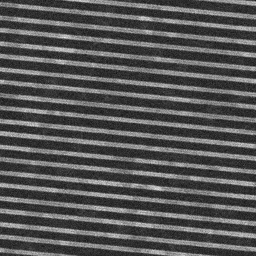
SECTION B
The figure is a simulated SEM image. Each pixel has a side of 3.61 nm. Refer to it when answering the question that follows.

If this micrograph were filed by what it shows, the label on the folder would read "parallel lines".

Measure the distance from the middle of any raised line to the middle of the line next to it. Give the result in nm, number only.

46.3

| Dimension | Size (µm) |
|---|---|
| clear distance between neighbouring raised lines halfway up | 0.0355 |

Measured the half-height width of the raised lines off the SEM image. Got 0.0112 micrometres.